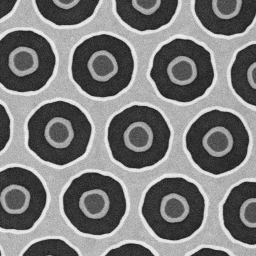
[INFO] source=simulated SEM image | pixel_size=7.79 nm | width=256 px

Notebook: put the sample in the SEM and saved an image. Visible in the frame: an array of small figures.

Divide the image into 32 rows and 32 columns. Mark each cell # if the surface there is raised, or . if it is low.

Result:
..##...##...##...###..##...###..
.####.......##....#...##...##...
######.....####.......###.......
################....#####......#
......#####...#############..###
.......###......####.....######.
..##...##........##.......####..
.###...##..###...##...#....##...
..##...##..###...##..###...##..#
.......##...##...##..###...##..#
......###.......###........##...
#....#####.....#####......###...
#######.#############....#####..
.####.....######...#############
.###.......###.......####.....##
.##...##...###.......###.......#
.##...###...#...###..##...##...#
.##...###..##...###..##...###..#
.##........###...#...##...###..#
####......####.......###.......#
######...######.....####......##
....#######.##############...###
.....####......#####....#######.
.##...##.......####......####...
###...##..###...##...#....##....
###...##..###...##..###...##...#
......##...##...##..###...##..##
.....###.......###........##...#
....#####......####......###....
############.######.....#####...
####.....######...############..
###.......###......#####....####